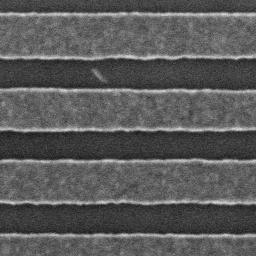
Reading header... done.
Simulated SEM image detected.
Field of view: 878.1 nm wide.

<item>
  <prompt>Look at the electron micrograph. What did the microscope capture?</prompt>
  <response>lines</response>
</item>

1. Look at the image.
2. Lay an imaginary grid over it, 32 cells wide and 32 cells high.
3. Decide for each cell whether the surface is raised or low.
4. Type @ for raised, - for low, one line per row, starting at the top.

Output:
--------------------------------
--------------------------------
@@@@@@@@@@@@@@@@@@@@@@@@@@@@@@@@
@@@@@@@@@@@@@@@@@@@@@@@@@@@@@@@@
@@@@@@@@@@@@@@@@@@@@@@@@@@@@@@@@
@@@@@@@@@@@@@@@@@@@@@@@@@@@@@@@@
@@@@@@@@@@@@@@@@@@@@@@@@@@@@@@@@
--------------------------------
--------------------------------
--------------------------------
--------------------------------
@@@@@@@@@@@@@@@@@@@@@@@@@@@@@@@@
@@@@@@@@@@@@@@@@@@@@@@@@@@@@@@@@
@@@@@@@@@@@@@@@@@@@@@@@@@@@@@@@@
@@@@@@@@@@@@@@@@@@@@@@@@@@@@@@@@
@@@@@@@@@@@@@@@@@@@@@@@@@@@@@@@@
--------------------------------
--------------------------------
--------------------------------
--------------------------------
@@@@@@@@@@@@@@@@@@@@@@@@@@@@@@@@
@@@@@@@@@@@@@@@@@@@@@@@@@@@@@@@@
@@@@@@@@@@@@@@@@@@@@@@@@@@@@@@@@
@@@@@@@@@@@@@@@@@@@@@@@@@@@@@@@@
@@@@@@@@@@@@@@@@@@@@@@@@@@@@@@@@
-@--@-@--@-------@@@-------@@@@@
--------------------------------
--------------------------------
--------------------------------
@@@@@@@@@@@@@@@@@@@@@@@@@@@@@@@@
@@@@@@@@@@@@@@@@@@@@@@@@@@@@@@@@
@@@@@@@@@@@@@@@@@@@@@@@@@@@@@@@@